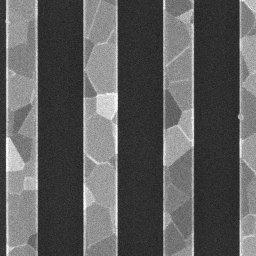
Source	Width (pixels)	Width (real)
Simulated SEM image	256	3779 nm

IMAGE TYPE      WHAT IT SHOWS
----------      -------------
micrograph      lines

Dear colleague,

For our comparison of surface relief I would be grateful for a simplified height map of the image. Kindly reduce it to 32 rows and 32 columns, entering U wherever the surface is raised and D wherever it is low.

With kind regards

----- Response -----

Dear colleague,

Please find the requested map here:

DUUUUDDDDDDUUUUDDDDDUUUUDDDDDDUU
DUUUUDDDDDDUUUUDDDDDUUUUDDDDDDUU
DUUUUDDDDDDUUUUDDDDDUUUUDDDDDDUU
DUUUUDDDDDDUUUUDDDDDUUUUDDDDDDUU
DUUUUDDDDDDUUUUDDDDDUUUUDDDDDDUU
DUUUUDDDDDDUUUUDDDDDUUUUDDDDDDUU
DUUUUDDDDDDUUUUDDDDDUUUUDDDDDDUU
DUUUUDDDDDDUUUUDDDDDUUUUDDDDDDUU
DUUUUDDDDDDUUUUDDDDDUUUUDDDDDDUU
DUUUUDDDDDDUUUUDDDDDUUUUDDDDDDUU
DUUUUDDDDDDUUUUDDDDDUUUUDDDDDDUU
DUUUUDDDDDDUUUUDDDDDUUUUDDDDDDUU
DUUUUDDDDDDUUUUDDDDDUUUUDDDDDDUU
DUUUUDDDDDDUUUUDDDDDUUUUDDDDDDUU
DUUUUDDDDDDUUUUDDDDDUUUUDDDDDDUU
DUUUUDDDDDDUUUUDDDDDUUUUDDDDDDUU
DUUUUDDDDDDUUUUDDDDDUUUUDDDDDDUU
DUUUUDDDDDDUUUUDDDDDUUUUDDDDDDUU
DUUUUDDDDDDUUUUDDDDDUUUUDDDDDDUU
DUUUUDDDDDDUUUUDDDDDUUUUDDDDDDUU
DUUUUDDDDDDUUUUDDDDDUUUUDDDDDDUU
DUUUUDDDDDDUUUUDDDDDUUUUDDDDDDUU
DUUUUDDDDDDUUUUDDDDDUUUUDDDDDDUU
DUUUUDDDDDDUUUUDDDDDUUUUDDDDDDUU
DUUUUDDDDDDUUUUDDDDDUUUUDDDDDDUU
DUUUUDDDDDDUUUUDDDDDUUUUDDDDDDUU
DUUUUDDDDDDUUUUDDDDDUUUUDDDDDDUU
DUUUUDDDDDDUUUUDDDDDUUUUDDDDDDUU
DUUUUDDDDDDUUUUDDDDDUUUUDDDDDDUU
DUUUUDDDDDDUUUUDDDDDUUUUDDDDDDUU
DUUUUDDDDDDUUUUDDDDDUUUUDDDDDDUU
DUUUUDDDDDDUUUUDDDDDUUUUDDDDDDUU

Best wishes